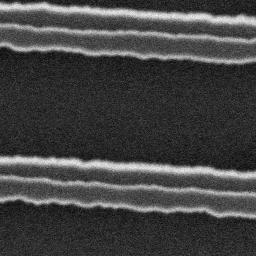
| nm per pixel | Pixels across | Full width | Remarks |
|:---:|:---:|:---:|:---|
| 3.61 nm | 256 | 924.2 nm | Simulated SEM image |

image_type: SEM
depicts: lines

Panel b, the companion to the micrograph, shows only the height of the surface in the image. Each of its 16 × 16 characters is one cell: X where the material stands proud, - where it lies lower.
XXX-------------
XXXXXXXXXXXXXXXX
XXXXXXXXXXXXXXXX
--------XXXXXXXX
----------------
----------------
----------------
----------------
----------------
----------------
XXXXXXXXXX------
XXXXXXXXXXXXXXXX
XXXXXXXXXXXXXXXX
---------------X
----------------
----------------